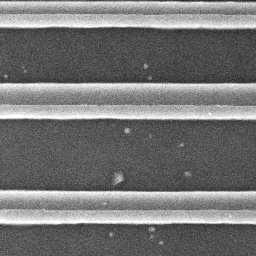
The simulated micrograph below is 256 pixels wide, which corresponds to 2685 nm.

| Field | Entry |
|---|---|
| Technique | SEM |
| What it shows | lines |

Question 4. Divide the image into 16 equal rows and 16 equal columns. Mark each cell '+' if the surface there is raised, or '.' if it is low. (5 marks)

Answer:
++++++++++++++++
++++++++++++++++
................
................
................
++++++++++++++++
++++++++++++++++
................
................
................
................
................
++++++++++++++++
++++++++++++++++
................
................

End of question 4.